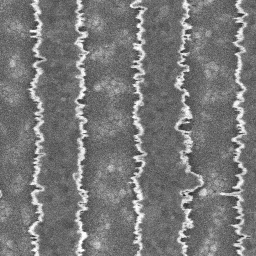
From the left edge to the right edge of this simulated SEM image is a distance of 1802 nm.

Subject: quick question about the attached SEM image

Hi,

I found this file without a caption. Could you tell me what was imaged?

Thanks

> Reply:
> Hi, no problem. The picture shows one or a few lines or trenches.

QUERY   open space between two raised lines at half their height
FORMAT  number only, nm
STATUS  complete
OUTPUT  387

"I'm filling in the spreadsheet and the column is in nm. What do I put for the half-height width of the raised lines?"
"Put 314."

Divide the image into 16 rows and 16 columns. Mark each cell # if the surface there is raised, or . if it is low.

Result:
..###....###...#
..###....###...#
..###....###...#
..###....##....#
..###....###...#
..###....##....#
..###....###...#
..###...###....#
..###....###...#
..###....###...#
..###....###...#
..###...####...#
..###....###...#
..###....###...#
..###....###...#
..###....##....#